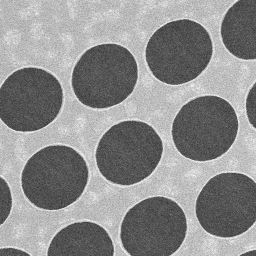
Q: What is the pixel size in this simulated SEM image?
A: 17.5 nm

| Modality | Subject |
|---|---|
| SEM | holes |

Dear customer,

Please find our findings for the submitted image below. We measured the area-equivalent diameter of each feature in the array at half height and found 1160 nm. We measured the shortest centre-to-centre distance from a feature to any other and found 1.37 microns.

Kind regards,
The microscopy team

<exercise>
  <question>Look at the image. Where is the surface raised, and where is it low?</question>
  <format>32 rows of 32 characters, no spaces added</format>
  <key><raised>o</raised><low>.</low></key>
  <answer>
ooooooooooooooooooooooooooooo...
oooooooooooooooooooooooooooo....
oooooooooooooooooooooo..oooo....
oooooooooooooooooooo......oo....
ooooooooooooooooooo.......oo....
ooooooooooooo..ooo.........o....
ooooooooooo.....oo.........oo...
oooooooooo.......o........oooooo
ooo..oooo........oo.......oooooo
o......oo........oo......ooooooo
........o........oooo..ooooooooo
........o........oooooooooooooo.
........oo......oooooooo....ooo.
........ooo..oooooooooo......oo.
.......ooooooooooooooo........o.
o.....oooooooo....oooo........o.
ooooooooooooo.......o.........oo
oooooooooooo........oo.......ooo
ooooo....ooo........oo.......ooo
oooo......oo........ooo.....oooo
ooo........o........oooooooooooo
ooo........o.......ooooooooooooo
.oo........oo.....oooooooo......
.oo........oooooooooooooo.......
.oo.......ooooooooooooooo.......
..oo.....oooooooo.....oo........
.ooooooooooooooo.......o........
.oooooooooooooo........oo.......
oooooooo.....oo........oo......o
ooooooo.......o........oooo...oo
oooooo........o........ooooooooo
...ooo........oo......ooooooooo.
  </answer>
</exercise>